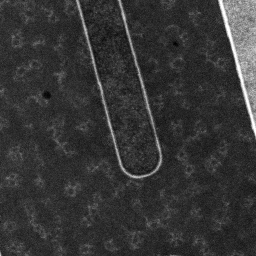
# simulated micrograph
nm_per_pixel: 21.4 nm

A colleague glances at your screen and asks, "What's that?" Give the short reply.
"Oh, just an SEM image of one or a few lines or trenches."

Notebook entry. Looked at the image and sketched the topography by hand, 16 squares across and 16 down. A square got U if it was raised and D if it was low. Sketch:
DDDDDUUUDDDDDDUU
DDDDDUUUDDDDDDUU
DDDDDDUUDDDDDDUU
DDDDDDUUDDDDDDDU
DDDDDDUUUDDDDDDU
DDDDDDUUUDDDDDDU
DDDDDDDUUDDDDDDD
DDDDDDDUUDDDDDDD
DDDDDDDUUUDDDDDD
DDDDDDDUUUDDDDDD
DDDDDDDDUUDDDDDD
DDDDDDDDDDDDDDDD
DDDDDDDDDDDDDDDD
DDDDDDDDDDDDDDDD
DDDDDDDDDDDDDDDD
DDDDDDDDDDDDDDDD